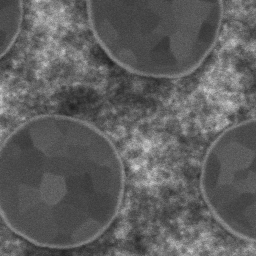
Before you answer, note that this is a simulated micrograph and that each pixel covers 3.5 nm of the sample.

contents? raised bodies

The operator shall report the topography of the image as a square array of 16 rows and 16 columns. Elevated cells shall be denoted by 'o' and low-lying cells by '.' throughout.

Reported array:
o.....oooooooo..
o.....oooooooo..
o.....ooooooo...
.......oooooo...
........oooo....
................
................
..ooo...........
.oooooo.......oo
ooooooo......ooo
oooooooo.....ooo
oooooooo.....ooo
oooooooo.....ooo
ooooooo......ooo
.ooooo.........o
................